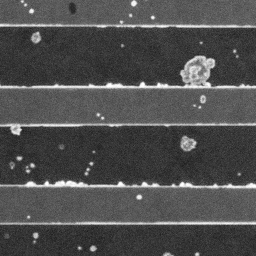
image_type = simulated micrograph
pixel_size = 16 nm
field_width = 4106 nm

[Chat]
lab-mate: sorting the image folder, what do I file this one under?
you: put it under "lines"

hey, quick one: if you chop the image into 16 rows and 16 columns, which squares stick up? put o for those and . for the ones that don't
oooooooooooooooo
oooooooooooooooo
................
................
................
oooooooooooooooo
oooooooooooooooo
oooooooooooooooo
................
................
................
................
oooooooooooooooo
oooooooooooooooo
................
................